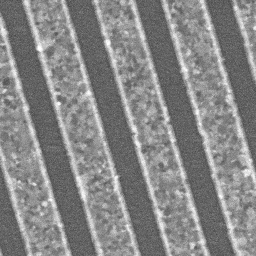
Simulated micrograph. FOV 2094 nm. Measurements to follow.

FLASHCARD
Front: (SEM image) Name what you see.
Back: one or a few lines or trenches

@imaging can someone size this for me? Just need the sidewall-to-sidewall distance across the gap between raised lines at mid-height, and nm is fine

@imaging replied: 261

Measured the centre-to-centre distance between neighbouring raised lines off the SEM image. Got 545 nm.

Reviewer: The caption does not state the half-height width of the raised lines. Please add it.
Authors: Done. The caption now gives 282 nanometers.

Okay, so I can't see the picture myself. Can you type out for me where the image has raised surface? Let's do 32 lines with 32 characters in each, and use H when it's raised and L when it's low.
LLLHHHHHLLLLHHHHHLLLLHHHHLLLLHHH
LLLLHHHHLLLLHHHHHLLLLHHHHHLLLLHH
LLLLHHHHLLLLLHHHHLLLLHHHHHLLLLHH
LLLLHHHHHLLLLHHHHLLLLLHHHHLLLLHH
LLLLLHHHHLLLLHHHHHLLLLHHHHHLLLLH
HLLLLHHHHLLLLLHHHHLLLLHHHHHLLLLH
HLLLLHHHHHLLLLHHHHLLLLHHHHHLLLLH
HLLLLHHHHHLLLLHHHHHLLLLHHHHLLLLL
HHLLLLHHHHLLLLHHHHHLLLLHHHHHLLLL
HHLLLLHHHHHLLLLHHHHLLLLHHHHHLLLL
HHLLLLHHHHHLLLLHHHHLLLLLHHHHLLLL
HHLLLLLHHHHLLLLHHHHHLLLLHHHHHLLL
HHHLLLLHHHHLLLLLHHHHLLLLHHHHHLLL
HHHLLLLHHHHHLLLLHHHHLLLLLHHHHLLL
HHHLLLLLHHHHLLLLHHHHHLLLLHHHHLLL
HHHHLLLLHHHHLLLLLHHHHLLLLHHHHHLL
HHHHLLLLHHHHHLLLLHHHHLLLLHHHHHLL
HHHHLLLLHHHHHLLLLHHHHHLLLLHHHHLL
HHHHHLLLLHHHHLLLLHHHHHLLLLHHHHHL
HHHHHLLLLHHHHLLLLLHHHHLLLLHHHHHL
LHHHHLLLLHHHHHLLLLHHHHLLLLLHHHHL
LHHHHLLLLLHHHHLLLLHHHHHLLLLHHHHH
LHHHHHLLLLHHHHLLLLLHHHHLLLLHHHHH
LHHHHHLLLLHHHHHLLLLHHHHLLLLHHHHH
LLHHHHLLLLHHHHHLLLLHHHHHLLLLHHHH
LLHHHHHLLLLHHHHLLLLHHHHHLLLLHHHH
LLHHHHHLLLLHHHHHLLLLHHHHLLLLHHHH
LLLHHHHLLLLHHHHHLLLLHHHHLLLLLHHH
LLLHHHHHLLLLHHHHLLLLHHHHHLLLLHHH
LLLHHHHHLLLLHHHHLLLLLHHHHLLLLHHH
LLLHHHHHLLLLHHHHHLLLLHHHHLLLLHHH
LLLLHHHHLLLLLHHHHLLLLHHHHHLLLLHH